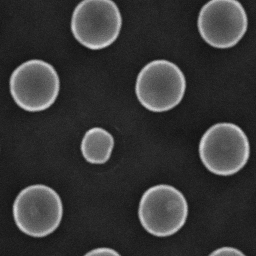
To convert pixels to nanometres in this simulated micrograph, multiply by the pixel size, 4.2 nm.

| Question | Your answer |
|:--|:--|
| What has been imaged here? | raised bodies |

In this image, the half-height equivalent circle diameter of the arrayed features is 204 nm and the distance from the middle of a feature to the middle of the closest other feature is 89.8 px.